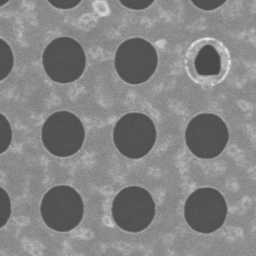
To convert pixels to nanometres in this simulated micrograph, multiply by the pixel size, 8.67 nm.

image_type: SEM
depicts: a regular array of holes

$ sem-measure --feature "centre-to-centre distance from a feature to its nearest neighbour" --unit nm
623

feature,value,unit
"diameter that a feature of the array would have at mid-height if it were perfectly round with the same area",0.39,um